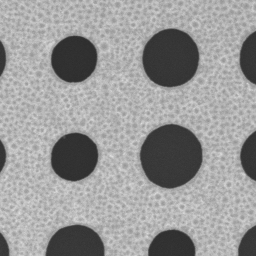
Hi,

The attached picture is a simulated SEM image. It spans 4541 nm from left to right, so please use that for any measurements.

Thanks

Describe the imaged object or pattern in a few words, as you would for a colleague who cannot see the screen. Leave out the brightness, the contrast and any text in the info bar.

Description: holes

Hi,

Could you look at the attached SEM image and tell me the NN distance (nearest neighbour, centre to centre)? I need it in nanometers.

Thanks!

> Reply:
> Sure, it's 1710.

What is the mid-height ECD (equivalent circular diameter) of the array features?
944 nm